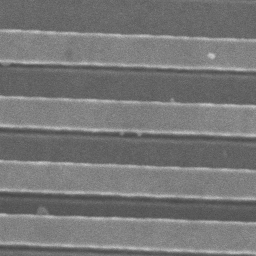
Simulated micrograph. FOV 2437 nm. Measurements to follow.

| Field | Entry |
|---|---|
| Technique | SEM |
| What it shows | lines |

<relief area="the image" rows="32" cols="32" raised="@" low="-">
--------------------------------
--------------------------------
--------------------------------
--------------------------------
@@@@@@@@@@@@@@@@@@@-------------
@@@@@@@@@@@@@@@@@@@@@@@@@@@@@@@@
@@@@@@@@@@@@@@@@@@@@@@@@@@@@@@@@
@@@@@@@@@@@@@@@@@@@@@@@@@@@@@@@@
----------------------@@@@@@@@@@
--------------------------------
--------------------------------
--------------------------------
@@@@@@@@@@@@@-------------------
@@@@@@@@@@@@@@@@@@@@@@@@@@@@@@@@
@@@@@@@@@@@@@@@@@@@@@@@@@@@@@@@@
@@@@@@@@@@@@@@@@@@@@@@@@@@@@@@@@
------------------@@@@@@@@@@@@@@
--------------------------------
--------------------------------
--------------------------------
@@@@@@@@@@@@--------------------
@@@@@@@@@@@@@@@@@@@@@@@@@@@@@@@@
@@@@@@@@@@@@@@@@@@@@@@@@@@@@@@@@
@@@@@@@@@@@@@@@@@@@@@@@@@@@@@@@@
-------------------@@@@@@@@@@@@@
--------------------------------
--------------------------------
@@@@@@@@@@@@@@@@@@@@@@----------
@@@@@@@@@@@@@@@@@@@@@@@@@@@@@@@@
@@@@@@@@@@@@@@@@@@@@@@@@@@@@@@@@
---@@@@@@@@@@@@@@@@@@@@@@@@@@@@@
-------------------------@@@@@@@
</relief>